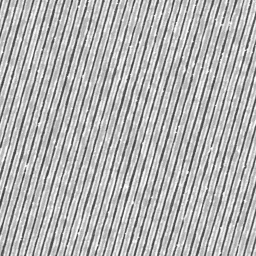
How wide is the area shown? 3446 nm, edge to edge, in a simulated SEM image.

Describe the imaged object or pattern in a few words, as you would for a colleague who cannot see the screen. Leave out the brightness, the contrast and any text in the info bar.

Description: parallel lines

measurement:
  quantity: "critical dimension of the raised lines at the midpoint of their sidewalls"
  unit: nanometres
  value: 61.6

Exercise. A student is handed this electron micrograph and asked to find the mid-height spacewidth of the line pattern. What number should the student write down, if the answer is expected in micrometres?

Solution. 0.0372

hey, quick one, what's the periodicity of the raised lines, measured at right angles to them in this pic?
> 101 nm